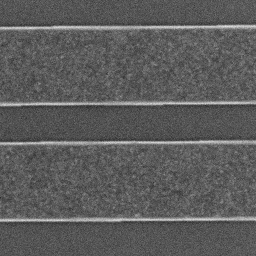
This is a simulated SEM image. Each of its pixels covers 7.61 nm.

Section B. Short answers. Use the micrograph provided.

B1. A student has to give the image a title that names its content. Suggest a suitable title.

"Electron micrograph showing wiring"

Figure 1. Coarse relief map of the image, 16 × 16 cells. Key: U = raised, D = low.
DDDDDDDDDDDDDDDD
DDDDDDDDDDDDDDDD
UUUUUUUUUUUUUUUU
UUUUUUUUUUUUUUUU
UUUUUUUUUUUUUUUU
UUUUUUUUUUUUUUUU
UUUDDDDDDDDDDDDD
DDDDDDDDDDDDDDDD
DDDDDDDDDDDDDDDD
UUUUUUUUUUUUUUUU
UUUUUUUUUUUUUUUU
UUUUUUUUUUUUUUUU
UUUUUUUUUUUUUUUU
UUUUUUUUUUUUUUUU
DDDDDDDDDDDDDDDD
DDDDDDDDDDDDDDDD